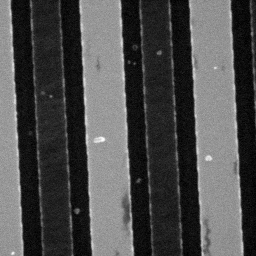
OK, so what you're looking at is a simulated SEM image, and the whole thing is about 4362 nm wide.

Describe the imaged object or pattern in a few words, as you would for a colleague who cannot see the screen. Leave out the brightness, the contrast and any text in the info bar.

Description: lines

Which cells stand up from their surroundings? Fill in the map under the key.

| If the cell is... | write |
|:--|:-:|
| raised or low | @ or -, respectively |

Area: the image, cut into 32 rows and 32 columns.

@---@@@---@@@@@---@@@---@@@@@--@
@---@@@@--@@@@@---@@@---@@@@@--@
@---@@@@--@@@@@---@@@---@@@@@--@
@---@@@@--@@@@@---@@@---@@@@@--@
@---@@@@--@@@@@---@@@---@@@@@--@
@@--@@@@--@@@@@---@@@---@@@@@---
@@--@@@@--@@@@@---@@@---@@@@@---
@@--@@@@--@@@@@---@@@@--@@@@@---
@@--@@@@--@@@@@@--@@@@--@@@@@---
@@--@@@@--@@@@@@--@@@@--@@@@@---
@@--@@@@--@@@@@@--@@@@--@@@@@---
@@--@@@@---@@@@@--@@@@--@@@@@---
@@--@@@@---@@@@@--@@@@--@@@@@---
@@---@@@---@@@@@--@@@@--@@@@@---
@@---@@@---@@@@@--@@@@--@@@@@---
@@---@@@---@@@@@--@@@@---@@@@@--
@@---@@@---@@@@@--@@@@---@@@@@--
@@---@@@---@@@@@--@@@@---@@@@@--
@@---@@@---@@@@@--@@@@---@@@@@--
@@---@@@---@@@@@--@@@@---@@@@@--
@@---@@@@--@@@@@---@@@---@@@@@--
@@---@@@@--@@@@@---@@@---@@@@@--
@@---@@@@--@@@@@---@@@---@@@@@--
@@---@@@@--@@@@@---@@@---@@@@@--
@@---@@@@--@@@@@---@@@---@@@@@--
@@@--@@@@--@@@@@---@@@---@@@@@--
@@@--@@@@--@@@@@---@@@---@@@@@--
@@@--@@@@--@@@@@---@@@@--@@@@@--
@@@--@@@@--@@@@@@--@@@@--@@@@@--
@@@--@@@@--@@@@@@--@@@@--@@@@@--
@@@--@@@@--@@@@@@--@@@@--@@@@@--
@@@--@@@@---@@@@@--@@@@--@@@@@--